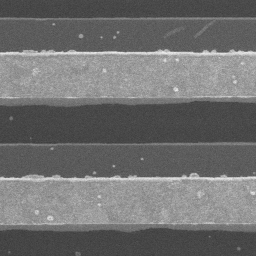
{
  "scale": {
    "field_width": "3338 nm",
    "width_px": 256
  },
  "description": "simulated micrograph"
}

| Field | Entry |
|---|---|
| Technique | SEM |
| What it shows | lines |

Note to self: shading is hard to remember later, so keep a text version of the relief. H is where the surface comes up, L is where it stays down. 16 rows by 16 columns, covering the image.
LLLLLLLLLLLLLLLL
HHHHHHHHHHHHHHHH
HHHHHHHHHHHHHHHH
HHHHHHHHHHHHHHHH
HHHHHHHHHHHHHHHH
HHHHHHHHHHHHHHHH
LLLLLLLLLLLLLLLL
LLLLLLLLLLLLLLLL
LLLLLLLLLLLLLLLL
HHHHHHHHHHHHHHHH
HHHHHHHHHHHHHHHH
HHHHHHHHHHHHHHHH
HHHHHHHHHHHHHHHH
HHHHHHHHHHHHHHHH
LLLLLLLLLLLLLLLL
LLLLLLLLLLLLLLLL